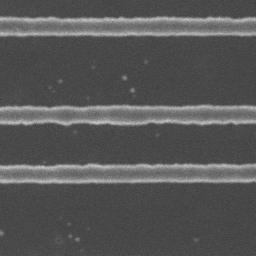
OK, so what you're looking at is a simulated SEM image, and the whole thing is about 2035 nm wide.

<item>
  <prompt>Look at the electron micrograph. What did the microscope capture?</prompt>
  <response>lines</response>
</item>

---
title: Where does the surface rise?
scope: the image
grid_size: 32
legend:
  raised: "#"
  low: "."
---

................................
................................
################################
################################
................................
................................
................................
................................
................................
................................
................................
................................
................................
#####..#########################
################################
...#....#.....####.......#......
................................
................................
................................
................................
................................
################################
################################
................................
................................
................................
................................
................................
................................
................................
................................
................................